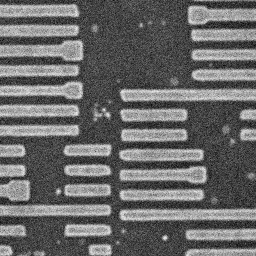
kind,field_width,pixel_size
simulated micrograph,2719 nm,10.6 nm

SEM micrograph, wiring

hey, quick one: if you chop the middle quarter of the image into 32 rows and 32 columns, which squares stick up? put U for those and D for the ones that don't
DDDDDDDDDDDDDDDDDDDDDDDDDDDDDDDD
UUUDDDDDDDDDDDDDDDDDDDDDDDDDDDDD
UUUDDDDDDDDDDDDDDDDDDDDDDDDDDDDD
DDDDDDDDDDDDDDDDDDDDDDDDDDDDDDDD
DDDDDDDDDDDDDDDDDDDDDDDDDDDDDDDD
UUUUDDDDDDDDDDDDDDDDDDDDDDDDDDDD
UUUUDDDDDDDDDDDDDDDDDDDDDDDDDDDD
UUUUDDDDDDDDDDDUUUUUUUUUUUUUUUUU
DDDDDDDDDDDDDDDUUUUUUUUUUUUUUUUU
DDDDDDDDDDDDDDDDDDDDDDDDDDDDDDDD
DDDDDDDDDDDDDDDDDDDDDDDDDDDDDDDD
UUUDDDDDDDDDDDDDDDDDDDDDDDDDDDDD
UUUDDDDDDDDDDDDUUUUUUUUUUUUUUUDD
DDDDDDDDDDDDDDDUUUUUUUUUUUUUUUDD
DDDDDDDDDDDDDDDDDDDDDDDDDDDDDDDD
DDDDDDDDDDDDDDDDDDDDDDDDDDDDDDDD
UUUDDDDDDDDDDDDDDDDDDDDDDDDDDDDD
DDDDDDDDDDDDDDDUUUUUUUUUUUUUUUDD
DDDDDDDDDDDDDDDUUUUUUUUUUUUUUUDD
DDDDDDDDDDDDDDDDDDDDDDDDDDDDDDDD
DDDDDDDDDDDDDDDDDDDDDDDDDDDDDDDD
DUUUUUUUUUUDDDDDDDDDDDDDDDDDDDDD
DUUUUUUUUUUDDDUUUUUUUUUUUUUUUUUU
DDDDDDDDDDDDDDDUUUUUUUUUUUUUUUUU
DDDDDDDDDDDDDDDDDDDDDDDDDDDDDDDD
DDDDDDDDDDDDDDDDDDDDDDDDDDDDDDDD
DUUUUUUUUUUDDDDDDDDDDDDDDDDDDDDU
DUUUUUUUUUDDDDUUUUUUUUUUUUUUUUUU
DDDDDDDDDDDDDDUUUUUUUUUUUUUUUUUU
DDDDDDDDDDDDDDDDDDDDDDDDDDDDDDDD
DUUUUUUUUUUDDDDDDDDDDDDDDDDDDDDD
DUUUUUUUUUUDDDDDDDDDDDDDDDDDDDDD